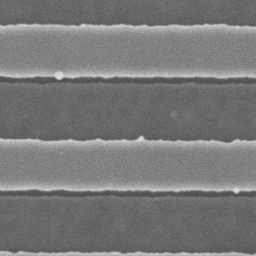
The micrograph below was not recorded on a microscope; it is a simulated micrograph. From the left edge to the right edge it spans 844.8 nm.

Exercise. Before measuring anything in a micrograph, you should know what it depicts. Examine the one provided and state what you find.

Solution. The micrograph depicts lines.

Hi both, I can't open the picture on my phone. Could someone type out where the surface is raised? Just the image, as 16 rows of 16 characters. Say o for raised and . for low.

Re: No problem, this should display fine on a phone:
................
................
oooooooooooooooo
oooooooooooooooo
oooooooooooooooo
................
................
................
................
oooooooooooooooo
oooooooooooooooo
oooooooooooooooo
................
................
................
................